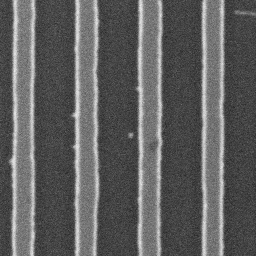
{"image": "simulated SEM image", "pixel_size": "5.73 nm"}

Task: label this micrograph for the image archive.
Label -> lines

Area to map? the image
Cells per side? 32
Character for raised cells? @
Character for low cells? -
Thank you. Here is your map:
--@@------@@-----@@@-----@@@----
--@@------@@-----@@@-----@@@----
--@@------@@-----@@@-----@@@----
--@@------@@-----@@@-----@@@----
--@@------@@-----@@@-----@@@----
--@@------@@-----@@@-----@@@----
--@@-----@@@-----@@@-----@@@----
--@@------@@-----@@@-----@@@----
--@@------@@-----@@@-----@@@----
--@@------@@-----@@@-----@@@----
--@@------@@-----@@@-----@@@----
--@@------@@-----@@@-----@@@----
--@@------@@-----@@@-----@@@----
--@@------@@-----@@@-----@@@----
--@@------@@-----@@@-----@@@----
--@@------@@-----@@@-----@@@----
--@@------@@-----@@@-----@@@----
--@@------@@-----@@@-----@@@----
--@@------@@-----@@@-----@@@----
--@@------@@-----@@@-----@@@----
--@@-----@@@-----@@@-----@@@----
--@@------@@-----@@@-----@@@----
--@@------@@-----@@@-----@@@----
--@@------@@-----@@@-----@@@----
--@@------@@-----@@@-----@@@----
--@@-----@@@-----@@@-----@@@----
--@@------@@-----@@@-----@@@----
--@@------@@-----@@@-----@@@----
--@@------@@-----@@@-----@@@----
--@@------@@-----@@@-----@@@----
--@@------@@-----@@@-----@@@----
--@@------@@-----@@@-----@@@----